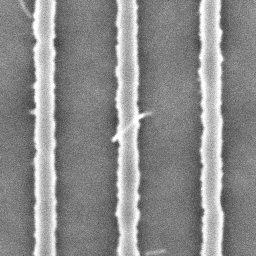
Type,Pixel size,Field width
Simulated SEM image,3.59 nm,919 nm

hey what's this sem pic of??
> lines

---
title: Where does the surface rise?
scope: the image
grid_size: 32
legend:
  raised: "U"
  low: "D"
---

DDDDDUUDDDDDDDDUUDDDDDDDDUUDDDDD
DDDDUUUDDDDDDDDUUDDDDDDDDUUDDDDD
DDDDUUUDDDDDDDDUUDDDDDDDDUUDDDDD
DDDDUUUDDDDDDDDUUDDDDDDDDUUDDDDD
DDDDUUUDDDDDDDDUUDDDDDDDDUUUDDDD
DDDDDUUDDDDDDDDUUDDDDDDDDUUDDDDD
DDDDUUUDDDDDDDDUUDDDDDDDDUUUDDDD
DDDDUUUDDDDDDDDUUDDDDDDDDUUUDDDD
DDDDDUUDDDDDDDDUUDDDDDDDDUUUDDDD
DDDDDUUDDDDDDDDUUDDDDDDDDUUUDDDD
DDDDUUUDDDDDDDDUUDDDDDDDDUUUDDDD
DDDDUUUDDDDDDDDUUDDDDDDDDUUUDDDD
DDDDUUUDDDDDDDDUUDDDDDDDDUUUDDDD
DDDDDUUDDDDDDDDUUDDDDDDDDUUDDDDD
DDDDUUUDDDDDDDDUUDDDDDDDDUUUDDDD
DDDDUUUDDDDDDDDUUDDDDDDDDUUUDDDD
DDDDUUUDDDDDDDDUUDDDDDDDDUUUDDDD
DDDDUUUDDDDDDDDUUDDDDDDDDUUUDDDD
DDDDDUUDDDDDDDDUUDDDDDDDDUUUDDDD
DDDDUUUDDDDDDDDUUDDDDDDDDUUUDDDD
DDDDUUUDDDDDDDDUUDDDDDDDDUUUDDDD
DDDDUUUDDDDDDDDUUDDDDDDDDUUUDDDD
DDDDUUUDDDDDDDDUUDDDDDDDDUUUDDDD
DDDDUUUDDDDDDDDUUDDDDDDDDUUUDDDD
DDDDUUUDDDDDDDDUUDDDDDDDDUUDDDDD
DDDDUUUDDDDDDDDUUDDDDDDDDUUDDDDD
DDDDUUUDDDDDDDDUUDDDDDDDDDUUDDDD
DDDDUUUDDDDDDDDUUDDDDDDDDUUUDDDD
DDDDDUUDDDDDDDDUUDDDDDDDDUUUDDDD
DDDDUUUDDDDDDDDUUDDDDDDDDUUUDDDD
DDDDUUUDDDDDDDDUUDDDDDDDDUUUDDDD
DDDDUUUDDDDDDDDUUDDDDDDDDUUUDDDD